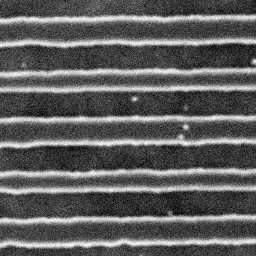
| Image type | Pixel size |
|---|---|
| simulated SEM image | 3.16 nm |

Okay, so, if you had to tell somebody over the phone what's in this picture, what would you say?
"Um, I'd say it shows lines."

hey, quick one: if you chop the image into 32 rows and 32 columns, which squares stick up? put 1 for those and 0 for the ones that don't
00000000000000000000000000000000
00000000000000000000000000000000
11111111111111111111111111111111
11111111111111111111111111111111
11111111111111111111111111111111
11100111111100001100000010000000
00000000000000000000000000000000
00000000000000000000000000000000
00000000000000000000000000000000
11111111111111111111111111111111
11111111111111111111111111111111
00000000000000000000000000000000
00000000000000000000000000000000
00000000000000000000000000000000
00000000000000000000000000000000
11111111111111111111111111111111
11111111111111111111111111111111
11111111111111111111111111111111
00000000000000000000000000000000
00000000000000000000000000000000
00000000000000000000000000000000
01100010000111111111111111111111
11111111111111111111111111111111
11111111111111111111111111111111
00000000000000000000000000000000
00000000000000000000000000000000
00000000000000000000000000000000
11111111111111111111111111111111
11111111111111111111111111111111
11111111111111111111111111111111
11111111111111101110010000000000
00000000000000000000000000000000